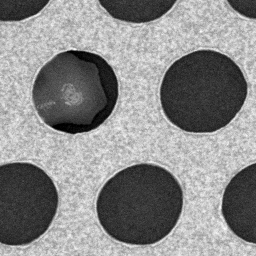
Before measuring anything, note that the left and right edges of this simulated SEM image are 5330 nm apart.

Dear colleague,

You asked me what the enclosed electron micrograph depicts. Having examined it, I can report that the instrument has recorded holes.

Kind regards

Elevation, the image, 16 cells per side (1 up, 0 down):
0001110000011110
1111111111111111
1111111111111111
1110001111110011
1100000111000001
1100000111000001
1100000111000001
1110000111100011
1111111111111111
1111111111111111
0011111100111110
0001111000011100
0000110000011100
0001110000011100
0001111000011110
1111111111111111